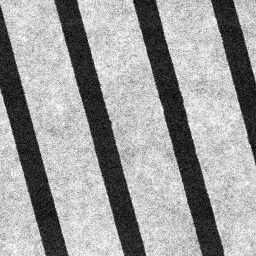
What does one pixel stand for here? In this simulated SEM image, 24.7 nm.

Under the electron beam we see one or a few lines or trenches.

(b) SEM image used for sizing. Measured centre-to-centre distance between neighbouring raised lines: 1860 nanometers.